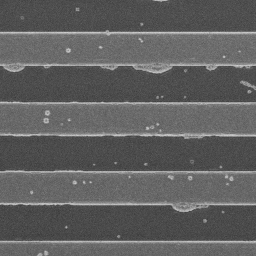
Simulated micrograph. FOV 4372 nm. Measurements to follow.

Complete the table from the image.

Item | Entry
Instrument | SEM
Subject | lines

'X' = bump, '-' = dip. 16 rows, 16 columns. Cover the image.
----------------
----------------
XXXXXXXXXXXXXXXX
XXXXXXXXXXXXXXXX
----------------
----------------
XXXXXXXXXXXXXXXX
XXXXXXXXXXXXXXXX
----------------
----------------
----------------
XXXXXXXXXXXXXXXX
XXXXXXXXXXXXXXXX
----------------
----------------
XXXXXXXXXXXXXXXX